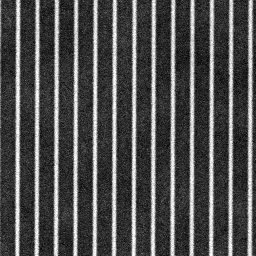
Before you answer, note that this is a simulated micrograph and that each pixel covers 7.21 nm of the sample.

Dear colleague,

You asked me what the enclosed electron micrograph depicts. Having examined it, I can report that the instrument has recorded parallel lines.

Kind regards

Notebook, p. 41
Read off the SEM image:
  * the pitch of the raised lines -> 140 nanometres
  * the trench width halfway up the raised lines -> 115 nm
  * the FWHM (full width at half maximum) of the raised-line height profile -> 25.3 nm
